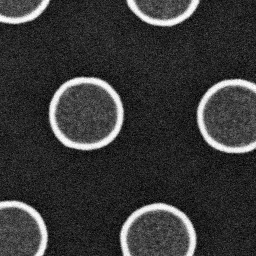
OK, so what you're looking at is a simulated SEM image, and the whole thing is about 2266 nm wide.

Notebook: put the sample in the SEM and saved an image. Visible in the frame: raised bodies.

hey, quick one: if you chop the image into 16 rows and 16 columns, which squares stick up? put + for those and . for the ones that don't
+++.....++++....
................
................
................
................
....+++......+++
...++++......+++
...++++......+++
....+++......+++
................
................
................
................
++......+++.....
+++.....++++....
+++.....++++....